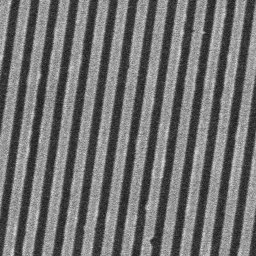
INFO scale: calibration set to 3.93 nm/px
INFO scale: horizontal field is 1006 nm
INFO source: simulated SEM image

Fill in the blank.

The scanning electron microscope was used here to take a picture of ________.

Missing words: parallel lines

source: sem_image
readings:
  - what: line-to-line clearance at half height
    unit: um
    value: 0.0355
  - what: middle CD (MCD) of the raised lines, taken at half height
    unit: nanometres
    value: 39.4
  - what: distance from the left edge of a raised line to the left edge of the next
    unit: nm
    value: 76.3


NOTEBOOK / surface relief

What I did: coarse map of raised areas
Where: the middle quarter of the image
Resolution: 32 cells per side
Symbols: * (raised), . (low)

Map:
.***..***..***..***..***..***..*
.***..***..***..**...**...**...*
.***..**...**...**...**...**...*
.**...**...**...**...**...**..**
.**...**...**...**..***..***..**
.**...**..***..***..***..***..**
***..***..***..***..***..***..**
***..***..***..***..***..**...**
***..***..***..**...**...**...**
***..**...**...**...**...**...**
**...**...**...**...**...**..***
**...**...**...**..***..***..***
**...**..***..***..***..***..***
**..***..***..***..***..***..**.
**..***..***..***..***..**...**.
**..***..***..**...**...**...**.
**..**...**...**...**...**...**.
*...**...**...**..***..***..***.
*...**...**...**..***..***..***.
*...**..***..***..***..***..**..
*..***..***..***..***..***..**..
*..***..**...***..***..**...**..
*..***..**...***..**...**...**..
*..**...**...**...**...**...**..
...**...**...**...**...**..***..
...**...**...**..***..***..***..
...**..***..***..***..***..**...
..***..***..***..***..***..**...
..***..***..***..***..***..**...
..***..***..**...**...**...**..*
..**...**...**...**...**...**..*
..**...**...**...**...**..***..*